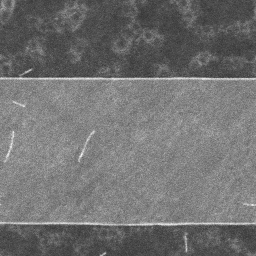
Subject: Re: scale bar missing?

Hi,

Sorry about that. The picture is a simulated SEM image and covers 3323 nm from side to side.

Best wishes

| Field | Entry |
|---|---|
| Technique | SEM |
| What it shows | one or a few lines or trenches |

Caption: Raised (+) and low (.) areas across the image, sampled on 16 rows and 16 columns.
................
................
................
................
................
++++++++++++++++
++++++++++++++++
++++++++++++++++
++++++++++++++++
++++++++++++++++
++++++++++++++++
++++++++++++++++
++++++++++++++++
++++++++++++++++
................
................